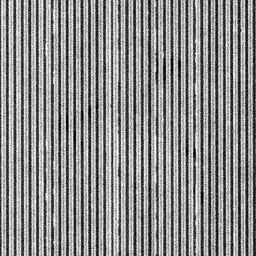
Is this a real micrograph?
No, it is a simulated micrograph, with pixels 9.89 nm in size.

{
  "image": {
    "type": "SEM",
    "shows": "parallel lines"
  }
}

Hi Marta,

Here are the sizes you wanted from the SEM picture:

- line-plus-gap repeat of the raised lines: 0.0739 microns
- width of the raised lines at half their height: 37.1 nm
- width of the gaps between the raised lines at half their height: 3.75 pixels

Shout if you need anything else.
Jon